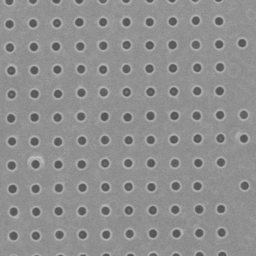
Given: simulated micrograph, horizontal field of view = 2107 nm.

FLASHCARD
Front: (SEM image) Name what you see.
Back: a regular array of holes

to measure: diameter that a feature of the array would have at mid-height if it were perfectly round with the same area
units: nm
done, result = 73.2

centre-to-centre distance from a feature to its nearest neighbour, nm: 188